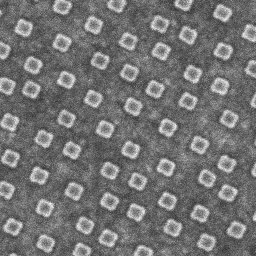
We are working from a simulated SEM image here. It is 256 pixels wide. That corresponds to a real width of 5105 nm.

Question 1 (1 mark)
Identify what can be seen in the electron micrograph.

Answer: a regular array of raised bodies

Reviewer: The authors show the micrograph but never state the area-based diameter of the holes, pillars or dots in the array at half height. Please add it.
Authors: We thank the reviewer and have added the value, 308 nm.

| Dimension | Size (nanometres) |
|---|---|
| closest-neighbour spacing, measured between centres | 601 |